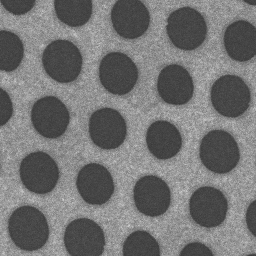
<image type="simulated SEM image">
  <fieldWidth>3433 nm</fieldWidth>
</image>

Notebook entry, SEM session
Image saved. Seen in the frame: a regular array of holes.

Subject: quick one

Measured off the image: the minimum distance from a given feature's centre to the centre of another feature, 756 nm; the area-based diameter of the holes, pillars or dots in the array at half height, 548 nanometres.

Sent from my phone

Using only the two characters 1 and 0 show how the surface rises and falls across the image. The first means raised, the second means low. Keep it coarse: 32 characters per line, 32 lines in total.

00001110000011000011111111111110
10011110000011000001110001111111
11111110000111000001100000111111
11111111111111000011100000110000
00111111111111100011100000110000
00011100011111111111110001110000
00011000001111011111111111110000
00011000001110001111111111111001
00111100001100000111000111111111
11111100001100000111000011110011
11111111111110000111000011100001
01111111111111001111000011000001
01111000111111111111000011000001
00110000111110111111111111100001
01110000011000011111111111110011
01110000011000001110001111111111
11111000111000001100001111001111
11111111111000001100000110000111
11111111111110011100000110000011
11100011111111111110001110000011
11100001111011111111111110000011
11000001110000111111111111100111
11100001110000111000111111111111
11100001110000111000011110011111
11111111110000111000011100001111
11111111111001111000011100001110
11000111111111111100011100001110
10000011100111111111111100001110
10000011000001111111111111111110
10000011000001110001111111111111
11000011000001100000111001111111
11111111000001100000111000011111